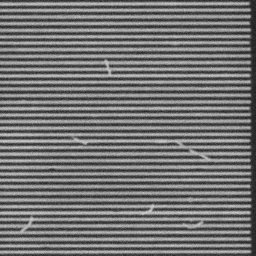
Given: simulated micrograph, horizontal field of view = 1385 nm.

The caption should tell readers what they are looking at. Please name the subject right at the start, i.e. parallel lines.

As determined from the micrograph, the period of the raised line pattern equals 35.2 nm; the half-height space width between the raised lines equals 20.9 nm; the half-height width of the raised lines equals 15.5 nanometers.